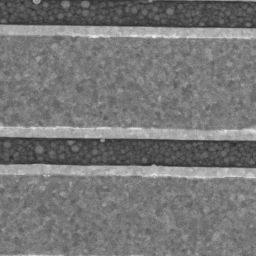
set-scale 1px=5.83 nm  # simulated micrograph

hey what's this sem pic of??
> one or a few lines or trenches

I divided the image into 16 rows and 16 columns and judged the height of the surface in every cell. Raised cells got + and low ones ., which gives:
................
................
++++++++++++++++
++++++++++++++++
++++++++++++++++
++++++++++++++++
++++++++++++++++
++++++++++++++++
................
................
................
++++++++++++++++
++++++++++++++++
++++++++++++++++
++++++++++++++++
++++++++++++++++